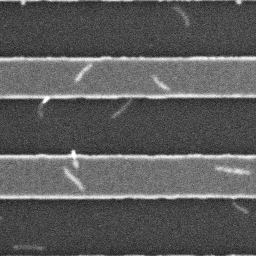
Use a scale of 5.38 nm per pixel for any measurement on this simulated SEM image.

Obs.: lines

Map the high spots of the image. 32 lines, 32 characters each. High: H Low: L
LLLLLLLLLLLLLLLLLLLLLLLLLLLLLLLL
LLLLLLLLLLLLLLLLLLLLLLLLLLLLLLLL
LLLLLLLLLLLLLLLLLLLLLLLLLLLLLLLL
LLLLLLLLLLLLLLLLLLLLLLLLLLLLLLLL
LLLLLLLLLLLLLLLLLLLLLLLLLLLLLLLL
LLLLLLLLLLLLLLLLLLLLLLLLLLLLLLLL
LLLLLLLLLLLLLLLLLLLLLLLLLLLLLLLL
HHHHHHHHHHHHHHHHHHHHHHHHHHHHHHHH
HHHHHHHHHHHHHHHHHHHHHHHHHHHHHHHH
HHHHHHHHHHHHHHHHHHHHHHHHHHHHHHHH
HHHHHHHHHHHHHHHHHHHHHHHHHHHHHHHH
HHHHHHHHHHHHHHHHHHHHHHHHHHHHHHHH
LLLLLLLLLLLLLLLLLLLLLLLLLLLLLLLL
LLLLLLLLLLLLLLLLLLLLLLLLLLLLLLLL
LLLLLLLLLLLLLLLLLLLLLLLLLLLLLLLL
LLLLLLLLLLLLLLLLLLLLLLLLLLLLLLLL
LLLLLLLLLLLLLLLLLLLLLLLLLLLLLLLL
LLLLLLLLLLLLLLLLLLLLLLLLLLLLLLLL
LLLLLLLLLLLLLLLLLLLLLLLLLLLLLLLL
HHHHHHHHHHHHHHHHHHHHHHHHHHHHHHHH
HHHHHHHHHHHHHHHHHHHHHHHHHHHHHHHH
HHHHHHHHHHHHHHHHHHHHHHHHHHHHHHHH
HHHHHHHHHHHHHHHHHHHHHHHHHHHHHHHH
HHHHHHHHHHHHHHHHHHHHHHHHHHHHHHHH
HHHHHHHHHHHHHHHHHHHHHHHHHHHHHHHH
LLLLLLLLLLLLLLLLLLLLLLLLLLLLLLLL
LLLLLLLLLLLLLLLLLLLLLLLLLLLLLLLL
LLLLLLLLLLLLLLLLLLLLLLLLLLLLLLLL
LLLLLLLLLLLLLLLLLLLLLLLLLLLLLLLL
LLLLLLLLLLLLLLLLLLLLLLLLLLLLLLLL
LLLLLLLLLLLLLLLLLLLLLLLLLLLLLLLL
LLLLLLLLLLLLLLLLLLLLLLLLLLLLLLLL